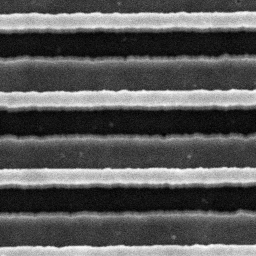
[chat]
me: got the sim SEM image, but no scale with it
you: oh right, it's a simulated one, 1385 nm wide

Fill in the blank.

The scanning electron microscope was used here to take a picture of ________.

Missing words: lines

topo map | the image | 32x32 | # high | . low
################################
################################
################################
######################.#########
................................
................................
................................
..##............###.#.##########
################################
################################
################################
################################
################################
.##.............................
................................
................................
................................
################################
################################
################################
################################
################################
################################
................................
................................
................................
................................
################################
################################
################################
################################
################################